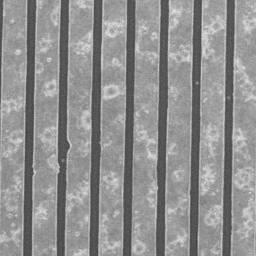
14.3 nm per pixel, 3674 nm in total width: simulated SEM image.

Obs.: parallel lines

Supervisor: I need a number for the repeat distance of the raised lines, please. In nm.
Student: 477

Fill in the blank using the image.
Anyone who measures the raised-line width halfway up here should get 339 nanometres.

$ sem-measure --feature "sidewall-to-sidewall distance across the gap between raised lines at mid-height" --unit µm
0.138